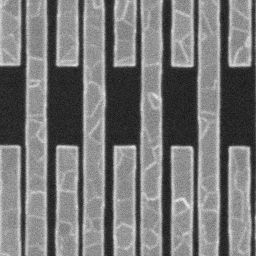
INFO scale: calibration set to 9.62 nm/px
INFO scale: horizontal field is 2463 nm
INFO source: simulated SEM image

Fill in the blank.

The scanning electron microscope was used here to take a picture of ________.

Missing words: wiring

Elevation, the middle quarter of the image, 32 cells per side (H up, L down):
LLLLLHHHHHLLLLLLLLLLHHHHLLLLLLLL
LLLLLHHHHHLLLLLLLLLLHHHHLLLLLLLL
LLLLLHHHHHLLLLLLLLLLHHHHLLLLLLLL
LLLLLHHHHHLLLLLLLLLLHHHHLLLLLLLL
LLLLLHHHHHLLLLLLLLLLHHHHLLLLLLLL
LLLLLHHHHHLLLLLLLLLLHHHHLLLLLLLL
LLLLLHHHHHLLLLLLLLLLHHHHLLLLLLLL
LLLLLHHHHHLLLLLLLLLLHHHHLLLLLLLL
LLLLLHHHHHLLLLLLLLLLHHHHLLLLLLLL
LLLLLHHHHHLLLLLLLLLLHHHHLLLLLLLL
LLLLLHHHHHLLLLLLLLLLHHHHLLLLLLLL
LLLLLHHHHHLLLLLLLLLLHHHHLLLLLLLL
LLLLLHHHHHLLLLLLLLLLHHHHLLLLLLLL
LLLLLHHHHHLLLLLLLLLLHHHHLLLLLLLL
LLLLLHHHHHLLLLLLLLLLHHHHLLLLLLLL
LLLLLHHHHHLLLLLLLLLLHHHHLLLLLLLL
LLLLLHHHHHLLLLLLLLLLHHHHLLLLLLLL
LLLLLHHHHHLLLLLLLLLLHHHHLLLLLLLL
LLLLLHHHHHLLLLLLLLLHHHHHLLLLLLLL
LLLLLHHHHHLLLLLLLLLHHHHHLLLLLLLL
LLLLLHHHHHLLLLLLLLLHHHHHLLLLLLLL
HHHLLHHHHHLLLHHHHHLHHHHHLLLHHHHH
HHHLLHHHHHLLLHHHHHLHHHHHLLLHHHHH
HHHLLHHHHHLLLHHHHHLHHHHHLLLHHHHH
HHHLLHHHHHLLLHHHHHLHHHHHLLLHHHHH
HHHLLHHHHHLLLHHHHHLHHHHHLLLHHHHH
HHHLLHHHHHLLLHHHHHLHHHHHLLLHHHHH
HHHLLHHHHHLLLHHHHHLLHHHHLLLHHHHH
HHHLLHHHHHLLLHHHHHLLHHHHLLLHHHHH
HHHLLHHHHHLLLHHHHHLLHHHHLLLHHHHH
HHHLLHHHHHLLLHHHHHLLHHHHLLLHHHHH
HHHLLHHHHHLLLHHHHHLLHHHHLLLHHHHH